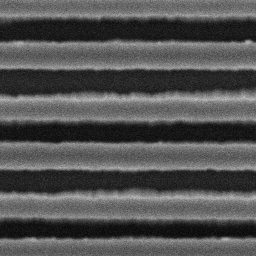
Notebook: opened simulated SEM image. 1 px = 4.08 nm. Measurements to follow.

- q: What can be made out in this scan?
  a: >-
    lines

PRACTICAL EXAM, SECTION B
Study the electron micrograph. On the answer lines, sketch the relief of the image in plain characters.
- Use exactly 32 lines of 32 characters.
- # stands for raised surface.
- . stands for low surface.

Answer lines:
################################
################################
................................
................................
................................
################################
################################
################################
.#..#############.##############
................................
................................
................................
################################
################################
################################
................................
................................
................................
################################
################################
################################
................................
................................
................................
################################
################################
################################
...........................#....
................................
................................
################################
################################